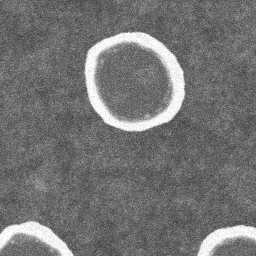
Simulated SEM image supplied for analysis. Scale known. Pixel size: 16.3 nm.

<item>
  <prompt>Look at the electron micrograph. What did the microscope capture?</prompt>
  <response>raised bodies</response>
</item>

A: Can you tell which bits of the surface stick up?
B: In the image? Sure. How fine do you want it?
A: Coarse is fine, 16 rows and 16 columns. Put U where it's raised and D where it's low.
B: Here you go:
DDDDDDDDDDDDDDDD
DDDDDDDDDDDDDDDD
DDDDDDDUUDDDDDDD
DDDDDDUUUUDDDDDD
DDDDDDUUUUUDDDDD
DDDDDDUUUUUDDDDD
DDDDDDUUUUUDDDDD
DDDDDDDUUUDDDDDD
DDDDDDDDDDDDDDDD
DDDDDDDDDDDDDDDD
DDDDDDDDDDDDDDDD
DDDDDDDDDDDDDDDD
DDDDDDDDDDDDDDDD
DDDDDDDDDDDDDDDD
DUDDDDDDDDDDDDDD
UUUUDDDDDDDDDUUU